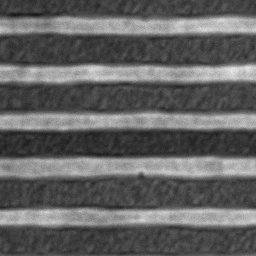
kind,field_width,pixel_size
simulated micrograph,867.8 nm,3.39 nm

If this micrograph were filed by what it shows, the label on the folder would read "parallel lines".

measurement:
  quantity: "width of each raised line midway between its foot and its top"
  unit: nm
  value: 58.4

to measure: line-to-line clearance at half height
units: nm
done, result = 104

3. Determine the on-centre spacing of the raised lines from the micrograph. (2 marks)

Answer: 162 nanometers